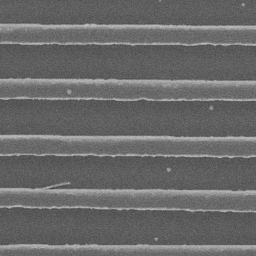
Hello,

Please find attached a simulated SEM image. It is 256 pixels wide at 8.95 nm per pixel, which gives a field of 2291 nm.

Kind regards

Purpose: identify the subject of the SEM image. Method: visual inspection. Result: lines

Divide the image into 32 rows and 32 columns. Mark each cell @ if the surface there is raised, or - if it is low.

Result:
--------------------------------
--------------------------------
--------------------------------
@@@@@@@@@@@@@@@@@@@@@@@@@@@@@@@@
@@@@@@@@@@@@@@@@@@@@@@@@@@@@@@@@
--@@@@@@@@@-@@@@@@@@@@@@@@@@@@@@
--------------------------------
--------------------------------
--------------------------------
--------------------------------
@@@@@@@@@@@@@@@@@@@@@@@@@@@@@@@@
@@@@@@@@@@@@@@@@@@@@@@@@@@@@@@@@
--------------@@@-@@@@@@@@@@@@@@
--------------------------------
--------------------------------
--------------------------------
--------------------------------
@@@@@@@@@@@@@@@@@@@@@@@@@@@@@@@@
@@@@@@@@@@@@@@@@@@@@@@@@@@@@@@@@
------------@-@-----@@@@@@@@@@@@
--------------------------------
--------------------------------
--------------------------------
-----@--------------------------
@@@@@@@@@@@@@@@@@@@@@@@@@@@@@@@@
@@@@@@@@@@@@@@@@@@@@@@@@@@@@@@@@
--------------------------------
--------------------------------
--------------------------------
--------------------------------
--------------------------------
@@@@@@@@@@@@@@@@@@@@@@@@@@@@@@@@